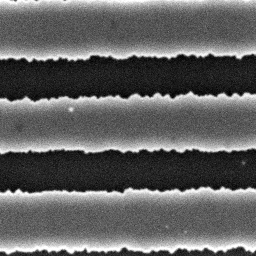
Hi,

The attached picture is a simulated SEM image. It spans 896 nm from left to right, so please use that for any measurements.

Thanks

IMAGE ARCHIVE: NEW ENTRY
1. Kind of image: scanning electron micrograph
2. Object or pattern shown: lines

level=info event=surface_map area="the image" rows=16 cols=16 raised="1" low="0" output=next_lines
1111111111111111
1111111111111111
1111111111111111
1111110101100000
0000000000000000
0000000000000000
1111111111111111
1111111111111111
1111111111111111
1000000000000000
0000000000000000
0000000000000000
1111111111111111
1111111111111111
1111111111111111
1111111111111111